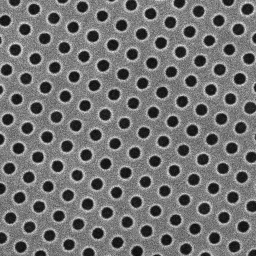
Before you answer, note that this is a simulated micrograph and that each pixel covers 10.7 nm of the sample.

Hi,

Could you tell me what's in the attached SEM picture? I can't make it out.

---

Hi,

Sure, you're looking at a regular array of holes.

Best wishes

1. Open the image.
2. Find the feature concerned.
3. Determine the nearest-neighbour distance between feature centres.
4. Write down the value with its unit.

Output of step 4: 0.23 micrometres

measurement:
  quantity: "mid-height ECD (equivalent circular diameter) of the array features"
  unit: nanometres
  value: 128